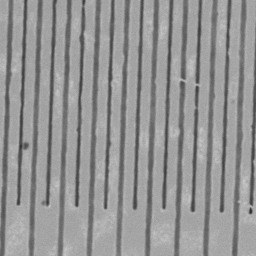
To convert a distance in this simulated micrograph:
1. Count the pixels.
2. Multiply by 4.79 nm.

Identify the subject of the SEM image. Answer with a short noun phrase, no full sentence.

parallel lines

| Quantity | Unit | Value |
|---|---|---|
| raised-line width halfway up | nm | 48.4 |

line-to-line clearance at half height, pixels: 4.61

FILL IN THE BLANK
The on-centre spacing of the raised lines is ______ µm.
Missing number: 0.0696